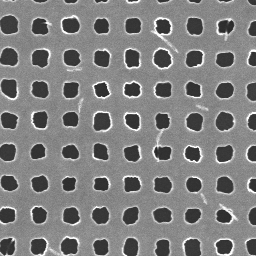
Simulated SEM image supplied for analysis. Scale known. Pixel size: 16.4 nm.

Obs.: a regular array of holes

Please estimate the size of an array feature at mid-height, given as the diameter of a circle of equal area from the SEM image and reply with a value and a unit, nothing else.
0.272 um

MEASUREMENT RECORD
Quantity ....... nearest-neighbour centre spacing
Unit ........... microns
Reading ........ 0.499